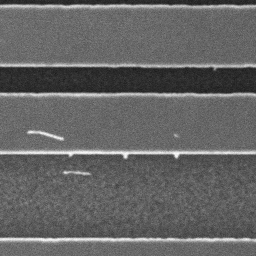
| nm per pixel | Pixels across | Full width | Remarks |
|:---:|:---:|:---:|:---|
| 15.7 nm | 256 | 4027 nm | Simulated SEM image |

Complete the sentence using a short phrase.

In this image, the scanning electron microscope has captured lines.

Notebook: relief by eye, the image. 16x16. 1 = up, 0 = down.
1111111111111111
1111111111111111
1111111111111111
1111111111111111
0000000000000000
0000000000000000
1111111111111111
1111111111111111
1111111111111111
1111111111111111
0000000000000000
0000000000000000
0000000000000000
0000000000000000
0000000000000000
1111111111111111